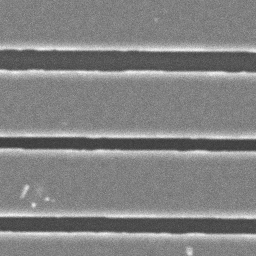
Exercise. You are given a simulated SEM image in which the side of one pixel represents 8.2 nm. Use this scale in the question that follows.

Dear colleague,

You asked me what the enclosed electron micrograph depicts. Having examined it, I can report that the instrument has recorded lines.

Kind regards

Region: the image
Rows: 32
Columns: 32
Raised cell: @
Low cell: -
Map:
@@@@@@@@@@@@@@@@@@@@@@@@@@@@@@@@
@@@@@@@@@@@@@@@@@@@@@@@@@@@@@@@@
@@@@@@@@@@@@@@@@@@@@@@@@@@@@@@@@
@@@@@@@@@@@@@@@@@@@@@@@@@@@@@@@@
@@@@@@@@@@@@@@@@@@@@@@@@@@@@@@@@
@@@@@@@@@@@@@@@@@@@@@@@@@@@@@@@@
--------------------------------
--------------------------------
--------------------------------
@@@@@@@@@@@@@@@@@@@@@@@@@@@@@@@@
@@@@@@@@@@@@@@@@@@@@@@@@@@@@@@@@
@@@@@@@@@@@@@@@@@@@@@@@@@@@@@@@@
@@@@@@@@@@@@@@@@@@@@@@@@@@@@@@@@
@@@@@@@@@@@@@@@@@@@@@@@@@@@@@@@@
@@@@@@@@@@@@@@@@@@@@@@@@@@@@@@@@
@@@@@@@@@@@@@@@@@@@@@@@@@@@@@@@@
@@@@@@@@@@@@@@@@@@@@@@@@@@@@@@@@
--------------------------------
--------------------------------
@@@@@@@@@@@@@@@@@@@@@@@@@@@@@@@@
@@@@@@@@@@@@@@@@@@@@@@@@@@@@@@@@
@@@@@@@@@@@@@@@@@@@@@@@@@@@@@@@@
@@@@@@@@@@@@@@@@@@@@@@@@@@@@@@@@
@@@@@@@@@@@@@@@@@@@@@@@@@@@@@@@@
@@@@@@@@@@@@@@@@@@@@@@@@@@@@@@@@
@@@@@@@@@@@@@@@@@@@@@@@@@@@@@@@@
@@@@@@@@@@@@@@@@@@@@@@@@@@@@@@@@
--------------------------------
--------------------------------
@@@@@@@@@@@@@@@@@@@@@@@@@@@@@@@@
@@@@@@@@@@@@@@@@@@@@@@@@@@@@@@@@
@@@@@@@@@@@@@@@@@@@@@@@@@@@@@@@@